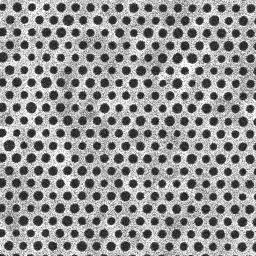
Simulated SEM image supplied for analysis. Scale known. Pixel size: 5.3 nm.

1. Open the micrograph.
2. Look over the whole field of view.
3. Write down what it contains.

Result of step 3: a regular array of holes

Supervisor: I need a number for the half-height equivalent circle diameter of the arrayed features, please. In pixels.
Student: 8.15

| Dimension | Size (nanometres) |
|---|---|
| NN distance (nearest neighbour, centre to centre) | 75.7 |